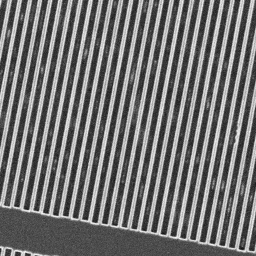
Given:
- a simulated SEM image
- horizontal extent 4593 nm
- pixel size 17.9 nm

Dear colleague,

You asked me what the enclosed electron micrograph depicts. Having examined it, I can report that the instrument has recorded parallel lines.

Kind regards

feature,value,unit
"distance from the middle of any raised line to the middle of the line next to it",179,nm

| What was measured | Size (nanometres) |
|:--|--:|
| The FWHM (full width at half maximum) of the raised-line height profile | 46.3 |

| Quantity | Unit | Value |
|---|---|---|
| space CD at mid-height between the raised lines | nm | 124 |